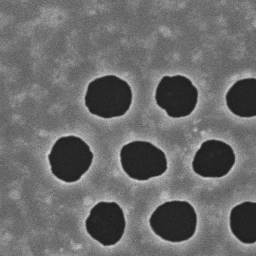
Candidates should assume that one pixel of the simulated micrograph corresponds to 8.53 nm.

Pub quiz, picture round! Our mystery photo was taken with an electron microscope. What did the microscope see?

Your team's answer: holes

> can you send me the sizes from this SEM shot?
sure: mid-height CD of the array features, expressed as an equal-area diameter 371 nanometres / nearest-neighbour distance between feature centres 0.583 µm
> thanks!